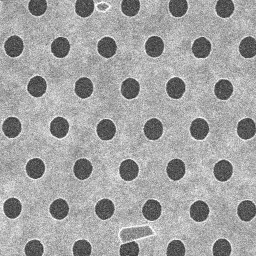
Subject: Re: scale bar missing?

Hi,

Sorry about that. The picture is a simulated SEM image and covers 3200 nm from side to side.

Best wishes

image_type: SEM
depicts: a regular array of holes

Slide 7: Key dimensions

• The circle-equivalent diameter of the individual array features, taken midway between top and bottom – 262 nm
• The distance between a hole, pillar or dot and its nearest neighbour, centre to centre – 0.576 micrometres